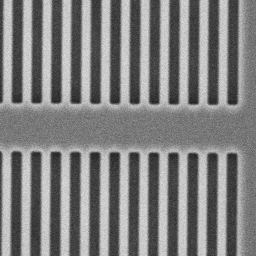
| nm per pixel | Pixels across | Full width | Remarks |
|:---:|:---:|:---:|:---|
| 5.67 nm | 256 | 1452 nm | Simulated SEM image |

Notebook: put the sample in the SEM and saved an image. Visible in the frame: groups of lines, slits or small figures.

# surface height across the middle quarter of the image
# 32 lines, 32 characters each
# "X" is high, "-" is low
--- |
XX--XX---XX---XX---XX---XX---XX-
XX--XX---XX---XX---XX---XX---XX-
XX--XX---XX---XX---XX---XX---XX-
XX--XX---XX---XX---XX---XX---XX-
XX--XX---XX---XX---XX---XX---XX-
XX--XX---XX---XX---XX---XX---XX-
XX--XX---XX---XX---XX---XX---XX-
XX--XX---XX---XX---XX---XX---XX-
XX--XX---XX---XX---XX---XX---XX-
XX--XX---XX---XX---XX---XX---XX-
XXXXXXXXXXXXXXXXXXXXXXXXXXXXXXXX
XXXXXXXXXXXXXXXXXXXXXXXXXXXXXXXX
XXXXXXXXXXXXXXXXXXXXXXXXXXXXXXXX
XXXXXXXXXXXXXXXXXXXXXXXXXXXXXXXX
XXXXXXXXXXXXXXXXXXXXXXXXXXXXXXXX
XXXXXXXXXXXXXXXXXXXXXXXXXXXXXXXX
XXXXXXXXXXXXXXXXXXXXXXXXXXXXXXXX
XXXXXXXXXXXXXXXXXXXXXXXXXXXXXXXX
XXXXXXXXXXXXXXXXXXXXXXXXXXXXXXXX
XXXXXXXXXXXXXXXXXXXXXXXXXXXXXXXX
XXXXXXXXXXXXXXXXXXXXXXXXXXXXXXXX
XXXXXXXXXXXXXXXXXXXXXXXXXXXXXXXX
XX--XX---XX---XX---XX---XX---XX-
X---XX---XX---XX---XX---XX---XX-
X---XX---XX---XX---XX---XX---XX-
X---XX---XX---XX---XX---XX---XX-
X---XX---XX---XX---XX---XX---XX-
X---XX---XX---XX---XX---XX---XX-
X---XX---XX---XX---XX---XX---XX-
X---XX---XX---XX---XX---XX---XX-
X---XX---XX---XX---XX---XX---XX-
X---XX---XX---XX---XX---XX---XX-